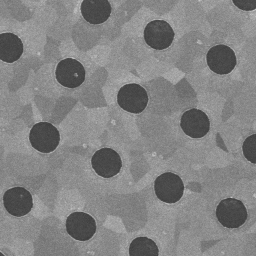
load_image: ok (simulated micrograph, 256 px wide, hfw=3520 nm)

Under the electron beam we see a regular array of holes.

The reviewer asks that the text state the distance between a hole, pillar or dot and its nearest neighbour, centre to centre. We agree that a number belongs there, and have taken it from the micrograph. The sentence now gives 923 nm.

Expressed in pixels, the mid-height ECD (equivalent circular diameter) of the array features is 30.8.